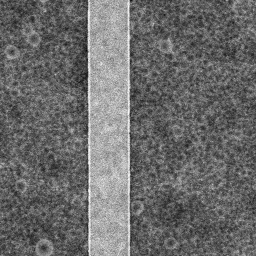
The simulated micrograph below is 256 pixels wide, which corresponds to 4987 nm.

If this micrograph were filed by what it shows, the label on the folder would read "one or a few lines or trenches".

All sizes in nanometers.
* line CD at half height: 769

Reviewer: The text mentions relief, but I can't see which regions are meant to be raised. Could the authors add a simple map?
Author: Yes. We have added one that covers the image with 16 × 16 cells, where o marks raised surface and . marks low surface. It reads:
......oo........
......oo........
......oo........
......oo........
......oo........
......oo........
......oo........
......oo........
......oo........
......oo........
......oo........
......oo........
......oo........
......oo........
......oo........
......oo........